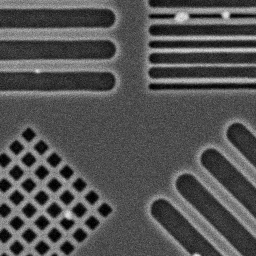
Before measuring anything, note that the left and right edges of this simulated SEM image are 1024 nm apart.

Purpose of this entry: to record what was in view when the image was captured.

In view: groups of lines, slits or small figures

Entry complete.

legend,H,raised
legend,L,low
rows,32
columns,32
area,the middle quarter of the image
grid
HHHHHHHHHHHHHHHHHHHHHHHHHHHHHHHH
HHHHHHHHHHHHHHHHHHHHHLLLLLLLLLLL
LLLLLLLLLLLLHHHHHHHHHLLLLLLLLLLL
LLLLLLLLLLLLLHHHHHHHHHLLLLLLLLLL
LLLLLLLLLLLLLHHHHHHHHHHHHHHHHHHH
LLLLLLLLLLLLLHHHHHHHHLLLLLLLLLLL
LLLLLLLLLLLLHHHHHHHHHHLLLLLLLLLL
HHHHHHHHHHHHHHHHHHHHHHHHHHHHHHHH
HHHHHHHHHHHHHHHHHHHHHHHHHHHHHHHH
HHHHHHHHHHHHHHHHHHHHHHHHHHHHHHHH
HHHHHHHHHHHHHHHHHHHHHHHHHHHHHHHH
HHHHHHHHHHHHHHHHHHHHHHHHHHHHHHHH
HHHHHHHHHHHHHHHHHHHHHHHHHHHHHHHH
HHHHHHHHHHHHHHHHHHHHHHHHHHHHHHHH
HHHHHHHHHHHHHHHHHHHHHHHHHHHHHHHH
HHHHHHHHHHHHHHHHHHHHHHHHHHHHHHHH
HHHHHHHHHHHHHHHHHHHHHHHHHHHHHHHH
HHHHHHHHHHHHHHHHHHHHHHHHHHHHHHHH
HHHHHHHHHHHHHHHHHHHHHHHHHHHHHHHH
HHHHHHHHHHHHHHHHHHHHHHHHHHHHHHHH
HHHHHHHHHHHHHHHHHHHHHHHHHHHHHHHH
HHHHHHHHHHHHHHHHHHHHHHHHHHHHHHHH
HHHHHHHHHHHHHHHHHHHHHHHHHHHHHHHH
HHHHHHHHHHHHHHHHHHHHHHHHHHHHHHHH
HHHHHHHHHHHHHHHHHHHHHHHHHHHHHHHH
LHHHHHHHHHHHHHHHHHHHHHHHHHHHHHHH
LLHHHHHHHHHHHHHHHHHHHHHHHHHHHHHH
LLHHHHHHHHHHHHHHHHHHHHHHHHHHHHLH
LHHHHHHHHHHHHHHHHHHHHHHHHHHHLLLL
HHHLLHHHHHHHHHHHHHHHHHHHHHHHLLLL
HHLLLLHHHHHHHHHHHHHHHHHHHHHHLLLL
HHHLLHHHHHHHHHHHHHHHHHHHHHHHLLLL